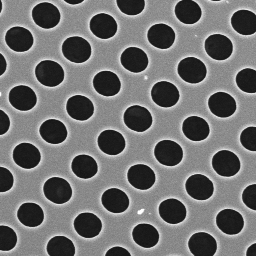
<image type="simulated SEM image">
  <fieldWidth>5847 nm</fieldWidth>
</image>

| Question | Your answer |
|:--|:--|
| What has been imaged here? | a regular array of holes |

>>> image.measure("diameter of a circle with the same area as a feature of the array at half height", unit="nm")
622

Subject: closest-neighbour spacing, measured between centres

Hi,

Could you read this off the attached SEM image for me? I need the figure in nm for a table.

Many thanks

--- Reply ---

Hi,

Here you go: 817